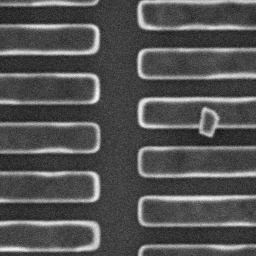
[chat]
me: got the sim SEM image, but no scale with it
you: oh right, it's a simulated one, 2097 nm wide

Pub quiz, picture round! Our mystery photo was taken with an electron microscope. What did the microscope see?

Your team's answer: groups of lines, slits or small figures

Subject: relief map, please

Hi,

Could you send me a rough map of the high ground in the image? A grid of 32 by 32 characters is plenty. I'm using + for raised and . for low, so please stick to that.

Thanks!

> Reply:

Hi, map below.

+++++....+++......++++++++++++++
.................+++++++++++++++
..................++++++++++++++
++++++++++++......++++++.+++++++
++++++++++++....................
++++++++++++....................
++++++++++++......++++++++++++++
.................+++++++++++++++
.................+++++++++++++++
++++++++++++......++++++++++++++
++++++++++++....................
++++++++++++....................
++++++++++++......+++++++++++.++
..................++++++++++++++
..................++++++++++++++
+++++++..+++......++++++++++++++
++++++++++++.............++.....
++++++++++++....................
++++++++++++......+..+++++++++++
.................+++++++++++++++
.................+++++++++++++++
.................+++++++++++++++
++++++++++++....................
++++++++++++....................
++++++++++++....................
.................+++++++++++++++
.................+++++++++++++++
.................+++++++++++++++
++++++++++++....................
++++++++++++....................
++++++++++++....................
..................++++++++++++++